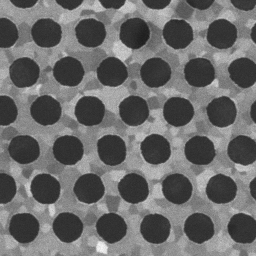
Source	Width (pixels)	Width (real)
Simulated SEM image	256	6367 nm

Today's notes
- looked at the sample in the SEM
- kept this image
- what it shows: a regular array of holes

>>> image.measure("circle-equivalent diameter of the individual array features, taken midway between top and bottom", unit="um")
0.777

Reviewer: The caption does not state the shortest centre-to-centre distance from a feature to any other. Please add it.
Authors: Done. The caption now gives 1090 nanometers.